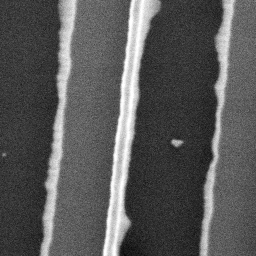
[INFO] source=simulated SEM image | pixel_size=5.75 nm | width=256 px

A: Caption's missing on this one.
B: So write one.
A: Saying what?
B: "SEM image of lines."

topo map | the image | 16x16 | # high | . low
....#####.....##
....#####.....##
....#####.....##
....#####.....##
....#####.....##
....####......##
....####......##
....####......##
....####......##
....####.....###
...#####.....###
...#####.....###
...#####.....###
...#####.....###
...#####.....###
...####......###